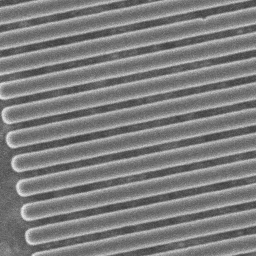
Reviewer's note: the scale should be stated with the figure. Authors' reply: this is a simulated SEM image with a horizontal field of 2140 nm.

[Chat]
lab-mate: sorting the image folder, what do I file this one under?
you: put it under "parallel lines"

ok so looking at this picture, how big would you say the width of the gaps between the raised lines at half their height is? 65.6 nm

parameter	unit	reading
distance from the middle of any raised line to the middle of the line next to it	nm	206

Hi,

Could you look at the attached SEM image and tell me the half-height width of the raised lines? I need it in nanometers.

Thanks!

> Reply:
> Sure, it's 138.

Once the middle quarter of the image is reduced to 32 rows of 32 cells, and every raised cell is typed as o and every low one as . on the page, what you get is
......ooooooooooooooooooooo.....
.ooooooooooooooooooooo..........
ooooooooooooooooo...........oooo
oooooooooooo..........oooooooooo
ooooooo..........ooooooooooooooo
oo..........oooooooooooooooooooo
........ooooooooooooooooooooo...
...oooooooooooooooooooo.........
ooooooooooooooooooo..........ooo
oooooooooooooo.........ooooooooo
ooooooooo..........ooooooooooooo
oooo..........oooooooooooooooooo
.........ooooooooooooooooooooo..
....ooooooooooooooooooooo.......
oooooooooooooooooooo..........oo
ooooooooooooooo..........ooooooo
oooooooooo..........oooooooooooo
ooooo..........ooooooooooooooooo
..........ooooooooooooooooooooo.
.....ooooooooooooooooooooo......
ooooooooooooooooooooo...........
oooooooooooooooo..........oooooo
ooooooooooo..........ooooooooooo
oooooo...........ooooooooooooooo
o..........ooooooooooooooooooooo
.......ooooooooooooooooooooo....
...oooooooooooooooooooo.........
oooooooooooooooooo...........ooo
ooooooooooooo...........oooooooo
oooooooo...........ooooooooooooo
ooo...........oooooooooooooooooo
.........oooooooooooooooooooo...